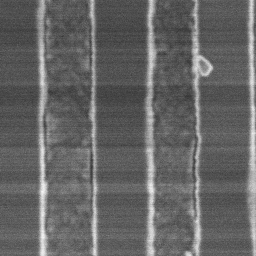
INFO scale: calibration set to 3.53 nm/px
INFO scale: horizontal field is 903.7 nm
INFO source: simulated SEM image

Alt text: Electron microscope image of lines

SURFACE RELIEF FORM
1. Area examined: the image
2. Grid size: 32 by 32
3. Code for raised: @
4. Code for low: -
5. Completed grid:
@@@@@------@@@@@@@@-----@@@@@@@-
@@@@@------@@@@@@@@-----@@@@@@@-
@@@@@-------@@@@@@@-----@@@@@@@-
@@@@@-------@@@@@@@-----@@@@@@@-
@@@@@-------@@@@@@@-----@@@@@@@@
@@@@@------@@@@@@@@------@@@@@@-
@@@@@-------@@@@@@@-----@@@@@@@@
@@@@@------@@@@@@@@------@@@@@@@
@@@@@------@@@@@@@@-----@@@@@@@@
@@@@@-------@@@@@@@------@@@@@@@
@@@@@-------@@@@@@@-----@@@@@@@@
@@@@@-------@@@@@@@------@@@@@@@
@@@@@-------@@@@@@@------@@@@@@@
@@@@@-------@@@@@@@------@@@@@@@
@@@@@-------@@@@@@@------@@@@@@@
@@@@@@@-----@@@@@@@------@@@@@@@
@@@@@@@-----@@@@@@@--@@--@@@@@@@
@@@@@-------@@@@@@@------@@@@@@@
@@@@@-------@@@@@@@------@@@@@@@
@@@@@-----@@@@@@@@@----@@@@@@@@@
@@@@@-----@@@@@@@@@----@@@@@@@@@
@@@@@-----@@@@@@@@@----@@@@@@@@@
@@@@@-----@@@@@@@@@------@@@@@@@
@@@@@-------@@@@@@@----@@@@@@@@@
@@@@@-------@@@@@@@-----@@@@@@@@
@@@@@-------@@@@@@@-----@@@@@@@@
@@@@@-------@@@@@@@------@@@@@@@
@@@@@-------@@@@@@@------@@@@@@@
@@@@@-------@@@@@@@------@@@@@@@
@@@@@-------@@@@@@@------@@@@@@@
@@@@@-------@@@@@@@------@@@@@@@
@@@@@-------@@@@@@@------@@@@@@@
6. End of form